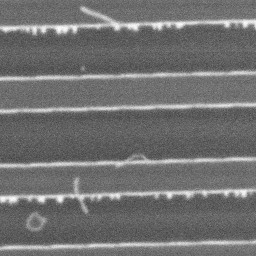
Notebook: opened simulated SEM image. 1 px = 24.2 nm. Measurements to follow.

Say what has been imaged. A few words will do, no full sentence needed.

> lines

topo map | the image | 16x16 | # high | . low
################
###########.....
................
................
................
################
################
................
................
................
################
################
................
................
................
################